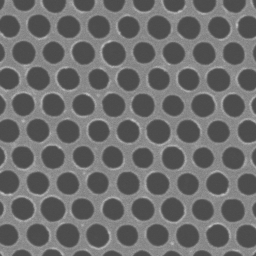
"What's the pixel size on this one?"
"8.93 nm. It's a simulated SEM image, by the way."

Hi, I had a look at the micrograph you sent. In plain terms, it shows a regular array of holes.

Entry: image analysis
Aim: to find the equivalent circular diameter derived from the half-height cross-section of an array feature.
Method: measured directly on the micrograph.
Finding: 203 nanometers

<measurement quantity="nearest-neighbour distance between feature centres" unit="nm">264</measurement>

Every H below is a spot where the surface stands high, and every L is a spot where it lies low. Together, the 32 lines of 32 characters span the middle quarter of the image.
HHHHHHHHHHHHHHHHHHHHHHHHHHHHHHHH
LLLHHHHLLLHHHHLLLHHHHHLLLHHHHHLL
LLLLHHLLLLLHHLLLLLHHHLLLLLHHHLLL
LLLLHHLLLLLHHLLLLLLHHLLLLLLHLLLL
LLLLHHLLLLLHHLLLLLLHHLLLLLHHLLLL
LLLHHHHLLLLHHHLLLLLHHHLLLLHHHLLL
HLHHHHHHHHHHHHHLLHHHHHHLLHHHHHLL
HHHHLHHHHHHLLHHHHHHLLHHHHHHHHHHH
HHHLLLLHHHLLLLLHHLLLLLHHHLLLLHHH
HHLLLLLLHHLLLLLHHLLLLLHHHLLLLLHH
HHLLLLLLHHLLLLLHHLLLLLLHLLLLLLHH
HHLLLLLLHHLLLLLHHLLLLLHHHLLLLLHH
HHHLLLLHHHLLLLHHHHLLLLHHHHLLLHHH
HHHHHHHHHHHHHHHHHHHHHHHHHHHHHHHH
LLHHHHHLLLHHHHLLLLHHHLLLLLHHHLLL
LLLLHHLLLLLHHHLLLLLHHLLLLLHHLLLL
LLLLHHLLLLLHHLLLLLLHHLLLLLLHLLLL
LLLLHHLLLLLHHLLLLLLHHLLLLLLHLLLL
LLLHHHHLLLLHHHLLLLLHHLLLLLHHHLLL
LLLHHHHHLHHHHHHLLHHHHHLLLHHHHHLL
HHHHHHHHHHHHHHHHHHHHHHHHHHHHHHHH
HHHLLLLHHHLLLLHHHHLLLHHHHLLLLHHH
HHLLLLLHHHLLLLLHHLLLLLHHHLLLLLHH
HHLLLLLLHLLLLLLHHLLLLLHHLLLLLLHH
HHHLLLLHHHLLLLLHHLLLLLHHHLLLLLHH
HHHLLLLHHHHLLLHHHHLLLHHHHLLLLHHH
HHHHHHHHHHHHHHHHHHHHHHHHHHHHHHHH
LLHHHHHLLLHHHHLLLLHHHHLLLHHHHHLL
LLLHHHLLLLLHHLLLLLHHHLLLLLHHHLLL
LLLLHHLLLLLHHLLLLLLHLLLLLLHHLLLL
LLLLHHLLLLLHHLLLLLLHHLLLLLHHLLLL
LLLHHHHLLLLHHHLLLLLHHLLLLLHHHLLL